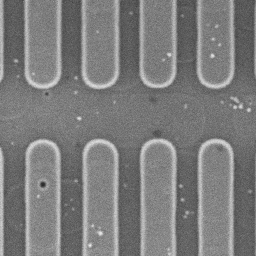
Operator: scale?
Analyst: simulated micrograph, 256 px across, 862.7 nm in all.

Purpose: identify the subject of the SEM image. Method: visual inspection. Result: wiring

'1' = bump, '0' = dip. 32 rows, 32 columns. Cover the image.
00011111001111100011110001111000
00011111001111100011110001111000
00011111001111100011110001111000
00011111001111100011110001111000
00011111001111100011110001111000
00011111001111100011110001111000
00011111001111100011110001111000
00011111001111100011110001111000
00011111001111100011110001111000
00011111001111100011110001111000
00001110000111000011100000110000
00000000000000000000000000000000
00000000000000000000000000000000
00000000000000000000000000000000
00000000000000000000000000000000
00000000000000000000000000000000
00000000000000000000000000000000
00000000000000000000000000000000
00001110000111000011110001111000
00011110000111100011110001111000
00011110000111100011110001111000
00011110000111100011110001111000
00011111000111100011110001111000
00011111000111100011110001111000
00011111000111100011110001111000
00011110000111100011110001111000
00011110000111100011110001111000
00011111000111100011110001111000
00011111000111100011110001111000
00011111000111100011110001111000
00011111000111100011110001111000
00011110000111100011110001111000